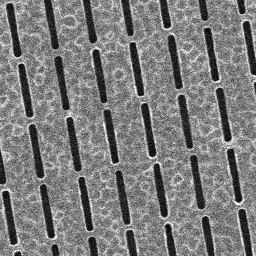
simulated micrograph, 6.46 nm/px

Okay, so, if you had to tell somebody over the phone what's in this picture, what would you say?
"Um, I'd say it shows a regular array of holes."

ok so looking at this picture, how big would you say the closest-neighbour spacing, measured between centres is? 244 nanometres